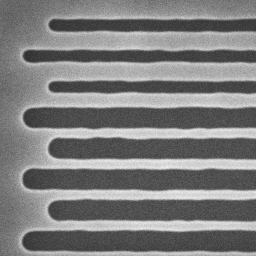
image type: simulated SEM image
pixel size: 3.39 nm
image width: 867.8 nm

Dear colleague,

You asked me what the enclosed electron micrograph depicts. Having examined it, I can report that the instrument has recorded groups of lines, slits or small figures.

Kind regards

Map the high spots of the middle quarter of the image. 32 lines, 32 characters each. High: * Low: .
********************************
********************************
********************************
********************************
................................
................................
................................
********************************
********************************
********************************
******************************..
................................
................................
................................
................................
................................
******************************.*
********************************
..................**............
................................
................................
................................
................................
................................
********************************
********************************
................................
................................
................................
................................
................................
................................